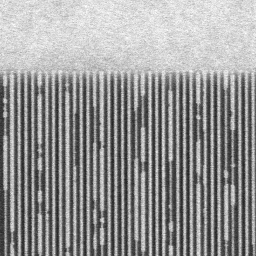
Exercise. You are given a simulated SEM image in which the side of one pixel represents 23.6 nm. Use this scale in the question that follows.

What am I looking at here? parallel lines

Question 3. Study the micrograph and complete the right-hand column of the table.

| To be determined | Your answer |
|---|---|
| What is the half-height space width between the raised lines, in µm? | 0.112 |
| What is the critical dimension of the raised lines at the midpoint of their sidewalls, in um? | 0.0677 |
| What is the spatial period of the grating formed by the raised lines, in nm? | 163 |